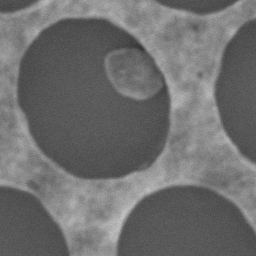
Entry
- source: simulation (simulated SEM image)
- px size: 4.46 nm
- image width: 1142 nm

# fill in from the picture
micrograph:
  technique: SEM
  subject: holes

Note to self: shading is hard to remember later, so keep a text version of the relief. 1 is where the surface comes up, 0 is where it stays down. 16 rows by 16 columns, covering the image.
0011111111100011
1110000111111110
1100000001111100
1000000001111100
1000000000111000
1000000000011000
1000000000011100
1000000000011100
1100000000011100
1100000000111110
1111000001111111
1111111111101111
0011111110000011
0001111100000001
0000111000000000
0000111000000000